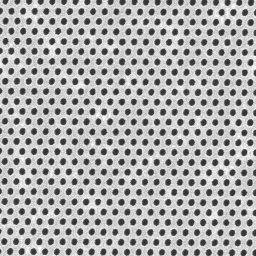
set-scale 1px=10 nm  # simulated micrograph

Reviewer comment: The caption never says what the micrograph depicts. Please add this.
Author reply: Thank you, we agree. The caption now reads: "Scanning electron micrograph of a regular array of holes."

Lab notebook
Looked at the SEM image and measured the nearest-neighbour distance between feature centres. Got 113 nm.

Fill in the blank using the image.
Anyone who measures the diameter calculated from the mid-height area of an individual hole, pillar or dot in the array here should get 68.9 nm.